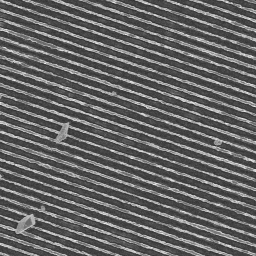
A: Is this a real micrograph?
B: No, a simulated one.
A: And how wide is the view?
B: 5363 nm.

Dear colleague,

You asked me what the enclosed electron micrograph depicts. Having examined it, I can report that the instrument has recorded parallel lines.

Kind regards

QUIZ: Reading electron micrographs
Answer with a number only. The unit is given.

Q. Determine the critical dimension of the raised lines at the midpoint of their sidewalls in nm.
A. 42.2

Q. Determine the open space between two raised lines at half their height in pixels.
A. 6.63